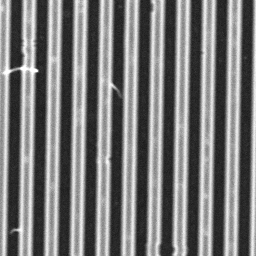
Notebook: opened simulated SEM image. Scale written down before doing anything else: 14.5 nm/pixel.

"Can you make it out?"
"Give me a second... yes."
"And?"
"parallel lines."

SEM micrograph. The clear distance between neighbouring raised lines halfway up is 210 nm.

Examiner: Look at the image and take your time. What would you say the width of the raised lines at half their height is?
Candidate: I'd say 157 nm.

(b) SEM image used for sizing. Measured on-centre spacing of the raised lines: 0.372 micrometres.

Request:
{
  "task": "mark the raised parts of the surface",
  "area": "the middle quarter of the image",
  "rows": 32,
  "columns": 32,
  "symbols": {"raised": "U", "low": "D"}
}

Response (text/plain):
DDDUUDDDDUUUDDDUUUDDDDUUDDDDUUUD
DDDUUDDDDUUUDDDUUUDDDDUUDDDDUUUD
DDDUUDDDDUUUDDDUUUDDDDUUDDDDUUUD
DDDUUDDDDUUUDDDUUUDDDDUUDDDDUUUD
DDDUUDDDDUUUDDDUUUDDDDUUDDDDUUUD
DDDUUDDDDUUUDDDUUUDDDDUUDDDDUUUD
DDDUUDDDDUUUDDDUUUDDDDUUDDDDUUUD
DDDUUDDDDUUUDDDUUUDDDDUUDDDDUUUD
DDDUUDDDDUUUDDDUUUDDDDUUDDDDUUUD
DDDUUDDDDUUUDDDUUUDDDDUUDDDDUUUD
DDUUUDDDDUUDDDDUUUDDDDUUDDDDUUUD
DDUUUDDDDUUDDDDUUUDDDDUUDDDDUUUD
DDUUUDDDDUUDDDDUUUDDDDUUDDDDUUUD
DDUUUDDDDUUDDDDUUUDDDDUUDDDDUUUD
DDUUUDDDDUUDDDDUUUDDDDUUDDDDUUUD
DDUUUDDDDUUDDDDUUUDDDDUUDDDDUUUD
DDUUUDDDDUUDDDDUUUDDDDUUDDDDUUUD
DDUUUDDDDUUDDDDUUUDDDDUUDDDDUUUD
DDUUUDDDDUUDDDDUUUDDDDUUDDDDUUUD
DDUUUDDDDUUDDDDUUUDDDDUUDDDDUUUD
DDUUUDDDDUUDDDDUUUDDDDUUDDDDUUDD
DDUUUDDDDUUDDDDUUUDDDDUUDDDDUUDD
DDUUUDDDDUUDDDDUUUDDDDUUDDDDUUDD
DDUUUDDDDUUDDDDUUUDDDDUUDDDDUUDD
DDUUUDDDDUUDDDDUUUDDDDUUDDDDUUDD
DDUUUDDDDUUDDDDUUUDDDDUUDDDDUUUD
DDUUUDDDDUUDDDDUUUDDDDUUDDDDUUDD
DDUUUDDDDUUDDDDUUUDDDUUUDDDDUUDD
DDUUUDDDDUUDDDDUUUDDDUUUDDDDUUDD
DDUUUDDDDUUDDDDUUDDDDUUUDDDDUUDD
DDUUUDDDDUUDDDDUUDDDDDUUDDDDUUDD
DDUUUDDDDUUDDDDUUDDDDDUUDDDDUUDD